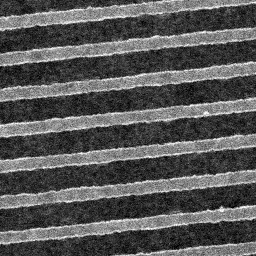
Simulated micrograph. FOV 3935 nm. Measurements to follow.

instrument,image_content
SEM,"parallel lines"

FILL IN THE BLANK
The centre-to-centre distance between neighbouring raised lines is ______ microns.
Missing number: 0.547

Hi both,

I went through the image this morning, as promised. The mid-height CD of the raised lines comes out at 0.183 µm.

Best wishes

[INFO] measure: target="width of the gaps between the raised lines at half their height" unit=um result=0.367